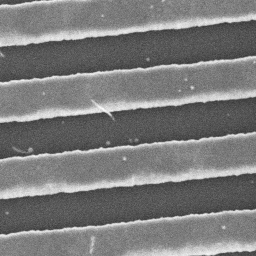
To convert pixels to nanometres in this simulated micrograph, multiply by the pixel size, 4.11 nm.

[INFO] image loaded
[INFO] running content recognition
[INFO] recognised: lines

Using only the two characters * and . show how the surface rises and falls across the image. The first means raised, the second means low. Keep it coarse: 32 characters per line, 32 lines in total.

..******************************
********************************
*******************************.
********************............
***********.....................
................................
................................
.............................***
...................*************
........************************
********************************
********************************
**************************......
****************................
******..........................
................................
................................
.........................*******
..............******************
....****************************
********************************
********************************
**********************..........
************....................
**..............................
................................
............................****
...................*************
.........***********************
********************************
********************************
***************************.....